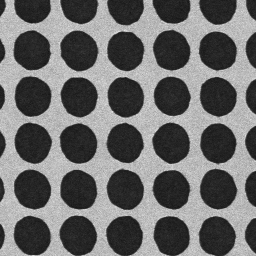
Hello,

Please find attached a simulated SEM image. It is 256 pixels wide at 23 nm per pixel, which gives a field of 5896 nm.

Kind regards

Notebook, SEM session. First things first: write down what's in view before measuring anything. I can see a regular array of holes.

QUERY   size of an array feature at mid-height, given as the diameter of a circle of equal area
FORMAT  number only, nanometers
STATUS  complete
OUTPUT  894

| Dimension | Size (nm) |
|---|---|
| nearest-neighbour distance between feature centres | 1060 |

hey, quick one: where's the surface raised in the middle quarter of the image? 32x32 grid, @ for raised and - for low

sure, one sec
@------@@@@@@-----@@@@@@------@@
@@----@@@@@@@@---@@@@@@@@@--@@@@
@@@@@@@@@@@@@@@@@@@@@@@@@@@@@@@@
@----@@@@@@@@---@@@@@@@@@----@@@
-------@@@@@------@@@@@@------@@
--------@@@--------@@@@--------@
--------@@@---------@@@--------@
--------@@@---------@@----------
--------@@@---------@@@---------
--------@@@---------@@@--------@
--------@@@---------@@@--------@
-------@@@@@-------@@@@@-------@
@-----@@@@@@@-----@@@@@@@----@@@
@@@@@@@@@@@@@@@-@@@@@@@@@@@@@@@@
@@@@@@@@@@@@@@@@@@@@@@@@@@@@@@@@
@-----@@@@@@@----@@@@@@@-----@@@
-------@@@@@------@@@@@-------@@
--------@@@--------@@@@--------@
--------@@@---------@@---------@
--------@@@---------@@---------@
--------@@@---------@@----------
--------@@@---------@@---------@
--------@@@--------@@@@--------@
@------@@@@@-------@@@@@------@@
@@----@@@@@@@@---@@@@@@@@----@@@
@@@@@@@@@@@@@@@@@@@@@@@@@@@@@@@@
@@@-@@@@@@@@@@--@@@@@@@@@@@-@@@@
------@@@@@@------@@@@@@------@@
-------@@@@--------@@@@-------@@
--------@@@--------@@@---------@
--------@@@---------@@---------@
--------@@----------@@----------